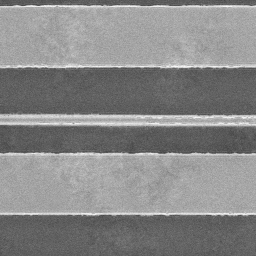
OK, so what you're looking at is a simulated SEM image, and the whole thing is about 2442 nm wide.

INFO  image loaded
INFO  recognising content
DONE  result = lines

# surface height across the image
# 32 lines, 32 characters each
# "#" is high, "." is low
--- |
................................
################################
################################
################################
################################
################################
################################
################################
................................
................................
................................
................................
................................
................................
................................
................................
................................
................................
................................
################################
################################
################################
################################
################################
################################
################################
################################
................................
................................
................................
................................
................................